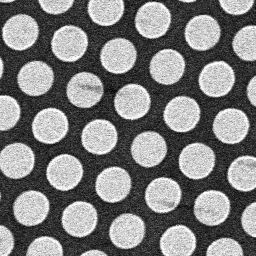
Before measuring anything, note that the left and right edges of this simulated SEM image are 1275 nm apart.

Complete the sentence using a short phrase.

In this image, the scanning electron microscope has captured a regular array of raised bodies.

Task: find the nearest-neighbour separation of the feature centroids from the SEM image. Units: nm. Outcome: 242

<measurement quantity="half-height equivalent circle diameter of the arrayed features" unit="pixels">36.4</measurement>